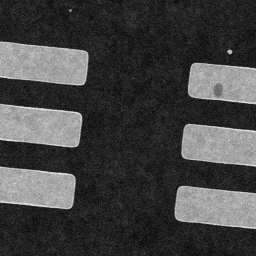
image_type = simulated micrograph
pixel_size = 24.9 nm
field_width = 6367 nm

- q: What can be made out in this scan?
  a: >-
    groups of lines, slits or small figures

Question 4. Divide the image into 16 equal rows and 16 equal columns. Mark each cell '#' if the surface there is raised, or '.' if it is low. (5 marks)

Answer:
................
................
................
#####...........
#####.......####
............####
................
#####...........
#####......#####
...........#####
#...............
#####...........
#####......#####
...........#####
................
................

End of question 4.